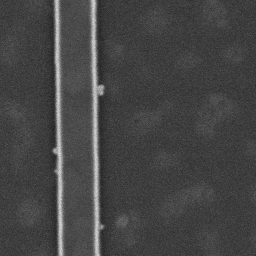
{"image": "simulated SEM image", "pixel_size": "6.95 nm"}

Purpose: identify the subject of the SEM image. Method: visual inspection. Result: one or a few lines or trenches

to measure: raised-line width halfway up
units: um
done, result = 0.256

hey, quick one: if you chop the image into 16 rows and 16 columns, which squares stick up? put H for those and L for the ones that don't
LLLLHHLLLLLLLLLL
LLLLHHLLLLLLLLLL
LLLLHHLLLLLLLLLL
LLLLHHLLLLLLLLLL
LLLLHHLLLLLLLLLL
LLLLHHLLLLLLLLLL
LLLLHHLLLLLLLLLL
LLLLHHLLLLLLLLLL
LLLLHHLLLLLLLLLL
LLLLHHLLLLLLLLLL
LLLLHHLLLLLLLLLL
LLLLHHLLLLLLLLLL
LLLLHHLLLLLLLLLL
LLLLHHLLLLLLLLLL
LLLLHHLLLLLLLLLL
LLLLHHLLLLLLLLLL